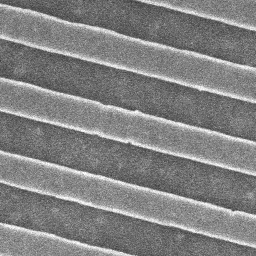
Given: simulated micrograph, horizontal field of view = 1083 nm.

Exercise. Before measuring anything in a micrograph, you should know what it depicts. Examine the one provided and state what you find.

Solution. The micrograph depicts one or a few lines or trenches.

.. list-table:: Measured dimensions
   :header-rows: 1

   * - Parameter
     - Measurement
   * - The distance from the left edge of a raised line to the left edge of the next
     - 299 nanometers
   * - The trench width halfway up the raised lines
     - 170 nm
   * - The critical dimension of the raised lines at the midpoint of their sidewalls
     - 128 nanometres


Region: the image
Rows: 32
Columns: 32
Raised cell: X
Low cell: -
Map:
--------------------XXXXXXXXXXXX
XXXX--------------------XXXXXXXX
XXXXXXX---------------------XXXX
XXXXXXXXXXXX-------------------X
XXXXXXXXXXXXXXX-----------------
---XXXXXXXXXXXXXXXX-------------
-------XXXXXXXXXXXXXXXXX--------
-----------XXXXXXXXXXXXXXXX-----
---------------XXXXXXXXXXXXXXXX-
-------------------XXXXXXXXXXXXX
XXX--------------------XXXXXXXXX
XXXXXX---------------------XXXXX
XXXXXXXXXXX--------------------X
XXXXXXXXXXXXXX------------------
---XXXXXXXXXXXXXXXX-------------
-------XXXXXXXXXXXXXXX----------
-----------XXXXXXXXXXXXXXX------
---------------XXXXXXXXXXXXXXX--
-------------------XXXXXXXXXXXXX
XX---------------------XXXXXXXXX
XXXXXX---------------------XXXXX
XXXXXXXXXX---------------------X
XXXXXXXXXXXXXX------------------
---XXXXXXXXXXXXXXX--------------
-------XXXXXXXXXXXXXXX----------
-----------XXXXXXXXXXXXXXX------
---------------XXXXXXXXXXXXXX---
------------------XXXXXXXXXXXXXX
XX---------------------XXXXXXXXX
XXXXXXX--------------------XXXXX
XXXXXXXXXX--------------------XX
XXXXXXXXXXXXXXX-----------------